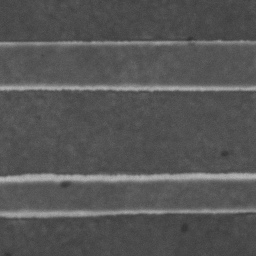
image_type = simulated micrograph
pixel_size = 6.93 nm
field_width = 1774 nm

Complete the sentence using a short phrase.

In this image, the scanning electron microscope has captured lines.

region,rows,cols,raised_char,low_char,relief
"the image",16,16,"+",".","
................
................
................
++++++++++++++++
++++++++++++++++
++++++++++++++++
................
................
................
................
................
++++++++++++++++
++++++++++++++++
................
................
................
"